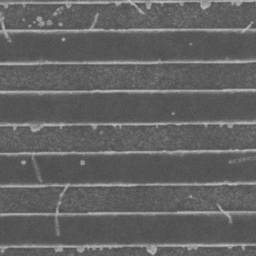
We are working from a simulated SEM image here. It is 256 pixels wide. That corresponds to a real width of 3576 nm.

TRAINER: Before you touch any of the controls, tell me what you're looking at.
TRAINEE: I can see lines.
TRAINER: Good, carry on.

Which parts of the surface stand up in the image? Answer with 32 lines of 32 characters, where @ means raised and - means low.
-------------------------@------
--------------------------------
--------------------------------
--------------------------------
@@@@@@@@@@@@@@@@@@@@@@@@@@@@@@@@
@@@@@@@@@@@@@@@@@@@@@@@@@@@@@@@@
@@@@@@@@@@@@@@@@@@@@@@@@@@@@@@@@
@@@@@@@@@@@@@@@@@@@@@@@@@@@@@@@@
--------------------------------
--------------------------------
--------------------------------
---@----@@@@@@@@@@@@@@@@@@@@@@@@
@@@@@@@@@@@@@@@@@@@@@@@@@@@@@@@@
@@@@@@@@@@@@@@@@@@@@@@@@@@@@@@@@
@@@@@@@@@@@@@@@@@@@@@@@@@@@@@@@@
@@@@@@@@@@@@@@@@@@@-------------
--------------------------------
--------------------------------
--------------------------------
@@@@@@@@@@@@@@@@@@@@@@@@@@@@@@@@
@@@@@@@@@@@@@@@@@@@@@@@@@@@@@@@@
@@@@@@@@@@@@@@@@@@@@@@@@@@@@@@@@
@@@@@@@@@@@@@@@@@@@@@@@@@@@@@@@@
--------------------------------
--------------------------------
--------------------------------
--------------------------------
@@@@@@@@@@@@@@@@@@@@@@@@@@@@@@@@
@@@@@@@@@@@@@@@@@@@@@@@@@@@@@@@@
@@@@@@@@@@@@@@@@@@@@@@@@@@@@@@@@
@@@@@@@@@@@@@@@@@@@@@@@@@@@@@@@@
--------------------------------